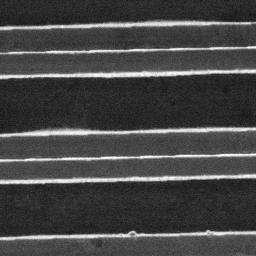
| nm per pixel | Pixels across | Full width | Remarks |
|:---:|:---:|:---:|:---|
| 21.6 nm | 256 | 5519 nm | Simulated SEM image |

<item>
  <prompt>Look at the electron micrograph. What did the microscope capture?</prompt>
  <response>lines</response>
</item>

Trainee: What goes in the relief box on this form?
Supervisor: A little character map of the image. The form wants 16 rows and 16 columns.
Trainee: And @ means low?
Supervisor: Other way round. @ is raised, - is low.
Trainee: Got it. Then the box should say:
----------------
---------------@
@@@@@@@@@@@@@@@@
@@@@@@@@@@@@@@@@
@@@@@@@@@@@@@---
----------------
----------------
----------------
@@@@@@@@@@@@@@@@
@@@@@@@@@@@@@@@@
@@@@@@@@@@@@@@@@
----------------
----------------
----------------
----------------
@@@@@@@@@@@@@@@@